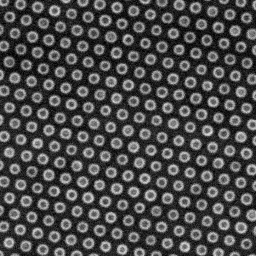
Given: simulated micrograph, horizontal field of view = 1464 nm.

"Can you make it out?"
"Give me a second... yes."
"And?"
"a regular array of raised bodies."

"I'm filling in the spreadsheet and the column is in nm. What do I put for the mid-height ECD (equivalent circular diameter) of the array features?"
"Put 51.7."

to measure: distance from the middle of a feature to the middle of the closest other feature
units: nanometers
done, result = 96